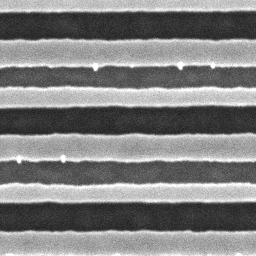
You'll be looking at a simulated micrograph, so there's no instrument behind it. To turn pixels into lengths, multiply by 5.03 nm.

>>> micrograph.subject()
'lines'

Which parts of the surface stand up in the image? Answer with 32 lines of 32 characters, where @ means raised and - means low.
@@@@@@@@@@@@@@@@@@@@@@@@@@@@@@@@
--------------------------------
--------------------------------
--------------------------------
--------------------------------
@@@@@@@@@@@@@@@@@@@@@@@@@@@@@@@@
@@@@@@@@@@@@@@@@@@@@@@@@@@@@@@@@
@@@@@@@@@@@@@@@@@@@@@@@@@@@@@@@@
@@@@@@@@@@@@@@@@@@@@@@@@@@@@@@@@
@@@@@@@@@@@@@@@@@@@@@@@@@@@@@@@@
@@@@@@@@@@@@@@@@@@@@@@@@@@@@@@@@
@@@@@@@@@@@@@@@@@@@@@@@@@@@@@@@@
@@@@@@@@@@@@@@@@@@@@@@@@@@@@@@@@
--------------------------------
--------------------------------
--------------------------------
--------------------------------
@@@@@@@@@@@@@@@@@@@@@@@@@@@@@@@@
@@@@@@@@@@@@@@@@@@@@@@@@@@@@@@@@
@@@@@@@@@@@@@@@@@@@@@@@@@@@@@@@@
@@@@@@@@@@@@@@@@@@@@@@@@@@@@@@@@
@@@@@@@@@@@@@@@@@@@@@@@@@@@@@@@@
@@@@@@@@@@@@@@@@@@@@@@@@@@@@@@@@
@@@@@@@@@@@@@@@@@@@@@@@@@@@@@@@@
@@@@@@@@@@@@@@@@@@@@@@@@@@@@@@@@
--------------------------------
--------------------------------
--------------------------------
--------------------------------
@@@@@@@@@@@@@@@@@@@@@@@@@@@@@@@@
@@@@@@@@@@@@@@@@@@@@@@@@@@@@@@@@
@@@@@@@@@@@@@@@@@@@@@@@@@@@@@@@@